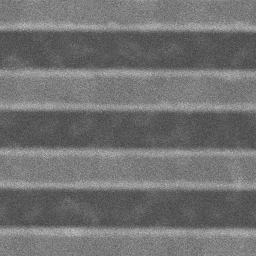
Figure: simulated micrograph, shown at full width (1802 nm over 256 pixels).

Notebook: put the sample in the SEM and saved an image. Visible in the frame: one or a few lines or trenches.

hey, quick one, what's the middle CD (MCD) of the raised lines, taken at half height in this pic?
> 235 nm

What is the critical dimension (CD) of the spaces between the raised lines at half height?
324 nm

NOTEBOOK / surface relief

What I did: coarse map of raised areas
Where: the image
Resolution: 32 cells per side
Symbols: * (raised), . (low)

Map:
********************************
********************************
********************************
................................
................................
................................
................................
................................
................................
********************************
********************************
********************************
********************************
.......................*........
................................
................................
................................
................................
................................
********************************
********************************
********************************
********************************
................................
................................
................................
................................
................................
................................
********************************
********************************
********************************